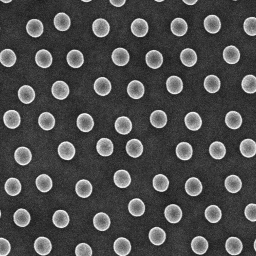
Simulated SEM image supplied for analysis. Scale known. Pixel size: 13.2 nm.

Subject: a regular array of raised bodies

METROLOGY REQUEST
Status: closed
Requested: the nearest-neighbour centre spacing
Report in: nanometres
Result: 427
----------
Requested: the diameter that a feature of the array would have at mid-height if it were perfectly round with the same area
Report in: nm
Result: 226